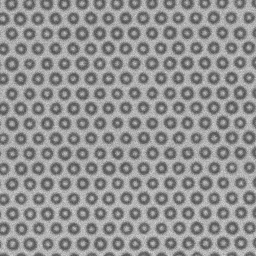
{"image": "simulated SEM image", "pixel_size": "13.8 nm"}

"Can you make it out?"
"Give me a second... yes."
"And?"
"a regular array of ring-shaped grooves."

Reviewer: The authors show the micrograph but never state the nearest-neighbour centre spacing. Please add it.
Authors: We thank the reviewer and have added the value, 234 nm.